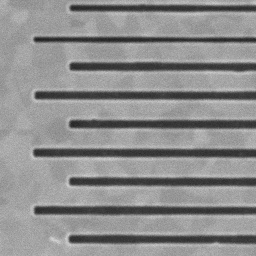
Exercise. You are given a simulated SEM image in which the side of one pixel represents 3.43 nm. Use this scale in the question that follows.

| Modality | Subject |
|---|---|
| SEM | parallel lines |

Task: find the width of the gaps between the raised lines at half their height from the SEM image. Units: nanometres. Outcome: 32.2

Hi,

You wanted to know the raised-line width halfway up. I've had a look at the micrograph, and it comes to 64.3 nm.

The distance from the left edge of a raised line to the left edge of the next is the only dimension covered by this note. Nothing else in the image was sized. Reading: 98.1 nm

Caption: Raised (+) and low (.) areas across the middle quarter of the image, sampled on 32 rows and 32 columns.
+...............................
+...............................
++++++++++++++++++++++++++++++++
++++++++++++++++++++++++++++++++
++++++++++++++++++++++++++++++++
++++++++++++++++++++++++++++++++
+...++++++++++..++++++++++++++++
................................
................................
++++++++++++++++++++++++++++++++
++++++++++++++++++++++++++++++++
++++++++++++++++++++++++++++++++
++++++++++++++++++++++++++++++++
+++++++.++++++++++++++++++++++++
+...............................
+...............................
++++++++++++++++++++++++++++++++
++++++++++++++++++++++++++++++++
++++++++++++++++++++++++++++++++
++++++++++++++++++++++++++++++++
++++++++++++++++++++++++++++++++
................................
................................
...........................+++..
++++++++++++++++++++++++++++++++
++++++++++++++++++++++++++++++++
++++++++++++++++++++++++++++++++
++++++++++++++++++++++++++++++++
+...............................
+...............................
++..............................
++++++++++++++++++++++++++++++++